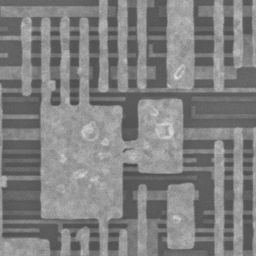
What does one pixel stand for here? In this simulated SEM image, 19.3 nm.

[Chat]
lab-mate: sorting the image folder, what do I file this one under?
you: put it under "wiring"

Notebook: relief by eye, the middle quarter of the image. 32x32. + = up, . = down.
+...++...++...++..++......++++++
+..+++...++..+++..++......++++++
+...++...++..+++..++......++++++
+...++...++..+++..++......++++++
+...++...++...++..++......++++++
+...++...++...++..++......++++++
+...++...++...++................
+...++..........................
+...++..........................
+...++.............++++++++++...
+++++++.+...++.....++++++++++...
++++++++++++++.....++++++++++...
++++++++++++++.....+++++++++++..
++++++++++++++.....+++++++++++..
++++++++++++++.....+++++++++++..
++++++++++++++.....++++++++++...
++++++++++++++.....++++++++++...
++++++++++++++.....++++++++++...
++++++++++++++....++++++++++++..
+++++++++++++++++++++++++++++...
+++++++++++++++++++++++++++++...
+++++++++++++++.+++++++++++++...
+++++++++++++++++++++++++++++...
+++++++++++++++++++++++++++++...
+++++++++++++++++++++++++++++...
++++++++++++++.....++++++++++...
++++++++++++++.....++++++++++...
++++++++++++++..................
++++++++++++++..................
++++++++++++++..................
++++++++++++++.....+......++++++
++++++++++++++.....+......++++++